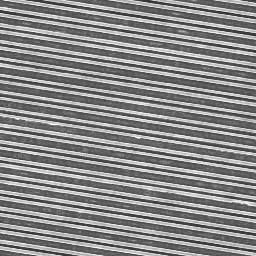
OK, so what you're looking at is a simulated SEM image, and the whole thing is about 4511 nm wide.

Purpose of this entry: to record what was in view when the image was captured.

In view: parallel lines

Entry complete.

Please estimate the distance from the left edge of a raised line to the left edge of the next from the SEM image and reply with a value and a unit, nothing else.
145 nm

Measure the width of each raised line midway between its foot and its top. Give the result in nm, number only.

47.9